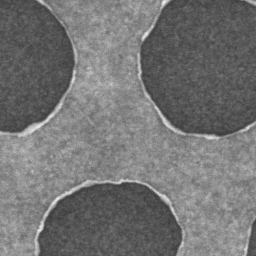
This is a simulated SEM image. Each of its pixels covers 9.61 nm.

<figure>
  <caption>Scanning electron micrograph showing holes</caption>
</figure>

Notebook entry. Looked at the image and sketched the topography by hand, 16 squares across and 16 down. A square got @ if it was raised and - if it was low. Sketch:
---@@@@@@@------
----@@@@@@------
----@@@@@-------
-----@@@@-------
-----@@@@-------
----@@@@@-------
----@@@@@@------
---@@@@@@@------
@@@@@@@@@@@@@-@@
@@@@@@@@@@@@@@@@
@@@@@@@@@@@@@@@@
@@@@@----@@@@@@@
@@@@------@@@@@@
@@@--------@@@@@
@@@--------@@@@@
@@---------@@@@-